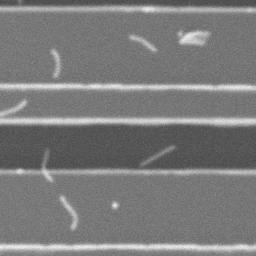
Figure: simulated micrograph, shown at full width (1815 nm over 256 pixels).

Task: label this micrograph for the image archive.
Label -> lines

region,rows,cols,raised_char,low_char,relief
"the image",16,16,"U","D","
DDDDDDDDDUDDDDDD
UUUUUUUUUUUUUUUU
UUUUUUUUUUUUUUUU
UUUUUUUUUUUUUUUU
UUUUUUUUUUUUUUUU
UUUUUUUUUUUUUUUU
UUUUUUUUUUUUUUUU
UUUUUUUUUUUUUUUU
DDDDDDDDDDDDDDDD
DDDDDDDDDDDDDDDD
DDDDDDDDDDDDDDDD
UUUUUUUUUUUUUUUU
UUUUUUUUUUUUUUUU
UUUUUUUUUUUUUUUU
UUUUUUUUUUUUUUUU
UUUUUUUUUUUUUUUU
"